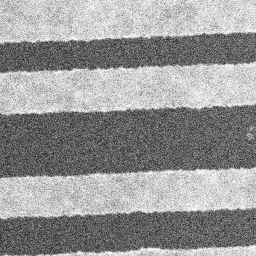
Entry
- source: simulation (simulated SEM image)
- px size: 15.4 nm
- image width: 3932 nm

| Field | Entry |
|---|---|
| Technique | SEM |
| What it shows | one or a few lines or trenches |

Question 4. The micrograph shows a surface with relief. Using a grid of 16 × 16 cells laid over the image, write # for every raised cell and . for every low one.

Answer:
################
################
#####...........
................
..#.############
################
################
................
................
................
................
################
################
##..............
................
..............##